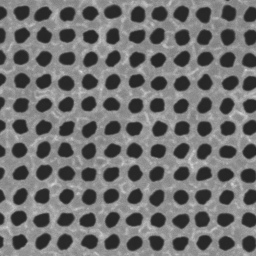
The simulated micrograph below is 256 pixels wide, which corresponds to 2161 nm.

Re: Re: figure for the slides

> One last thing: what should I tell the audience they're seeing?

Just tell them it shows a regular array of holes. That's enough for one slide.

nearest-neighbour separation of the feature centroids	185	nanometres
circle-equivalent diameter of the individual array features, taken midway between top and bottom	15	px